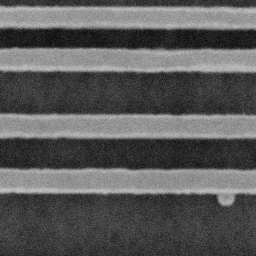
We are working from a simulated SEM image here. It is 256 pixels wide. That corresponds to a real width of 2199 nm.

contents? lines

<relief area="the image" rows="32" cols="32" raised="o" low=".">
................................
oooooooooooooooooooooooooooooooo
oooooooooooooooooooooooooooooooo
...................ooo....oooooo
................................
................................
oooooooooooooooooooooooooooooooo
oooooooooooooooooooooooooooooooo
oooooooooooooooooooooooooooooooo
................................
................................
................................
................................
................................
ooo.....oo.....oo...............
oooooooooooooooooooooooooooooooo
oooooooooooooooooooooooooooooooo
................................
................................
................................
................................
oooooooooooooooooooooooooooooooo
oooooooooooooooooooooooooooooooo
oooooooooooooooooooooooooooooooo
................................
................................
................................
................................
................................
................................
................................
................................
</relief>